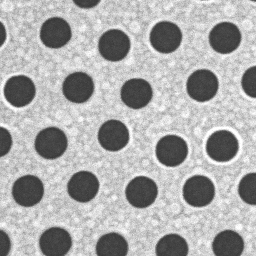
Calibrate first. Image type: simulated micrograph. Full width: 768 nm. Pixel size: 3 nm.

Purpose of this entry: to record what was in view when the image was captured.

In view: a regular array of holes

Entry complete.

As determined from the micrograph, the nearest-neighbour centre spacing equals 158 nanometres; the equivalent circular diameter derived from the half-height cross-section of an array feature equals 95.8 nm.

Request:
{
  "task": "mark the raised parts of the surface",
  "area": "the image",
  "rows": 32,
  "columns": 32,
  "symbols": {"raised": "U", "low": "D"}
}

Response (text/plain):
UUUUUUUUUDDDUUUUUUUUUUUUUUUUUUUU
UUUUUUUUUUUUUUUUUUUUUUUUUUUUUUUU
UUUUUUDDUUUUUUUUUUUUUUUUUUUUUUUU
DUUUUDDDDUUUUUUUUUUDDDUUUUUDDDUU
DUUUUDDDDUUUUDDDUUUDDDDUUUDDDDUU
UUUUUDDDUUUUDDDDUUUDDDUUUUDDDDUU
UUUUUUUUUUUUDDDDUUUUDUUUUUUDDUUU
UUUUUUUUUUUUUUDUUUUUUUUUUUUUUUUU
UUUUUUUUUUUUUUUUUUUUUUUUUUUUUUUD
UUDUUUUUDDDUUUUUUUUUUUUUDDDUUUDD
UDDDUUUUDDDDUUUDDDDUUUUDDDDUUUDD
UDDDUUUUDDDDUUUDDDDUUUUDDDDUUUUD
UDDDUUUUUDDUUUUDDDDUUUUUDDUUUUUU
UUUUUUUUUUUUUUUUDDUUUUUUUUUUUUUU
UUUUUUUUUUUUUUUUUUUUUUUUUUUUUUUU
UUUUUUUUUUUUUDDUUUUUUUUUUUUUUUUU
DUUUUDDDUUUUDDDDUUUUUUUUUUUDDUUU
DUUUDDDDUUUUDDDDUUUUDDDUUUDDDDUU
DUUUDDDDUUUUUDDUUUUDDDDUUUDDDDUU
UUUUUDDDUUUUUUUUUUUUDDDUUUDDDUUU
UUUUUUUUUUUUUUUUUUUUDDUUUUUUUUUU
UUUUUUUUUUDUUUUUUUUUUUUUUUUUUUUU
UUDDDUUUUDDDUUUUDDDUUUUDDDUUUUDD
UUDDDUUUDDDDUUUUDDDDUUUDDDDUUUDD
UUDDDUUUUDDDUUUUDDDDUUUDDDDUUUDD
UUDDDUUUUUUUUUUUDDDUUUUUDDUUUUUD
UUUUUUUUUUUUUUUUUUUUUUUUUUUUUUUU
UUUUUUUUUUUUUUUUUUUUUUUUUUUUUUUU
UUUUUUDDUUUUUUUUUUUUUUUUUUUUUUUU
DUUUUDDDDUUUUDDUUUUUUDDUUUUDDDUU
DUUUUDDDDUUUDDDDUUUUDDDUUUUDDDUU
DUUUUDDDDUUUDDDDUUUUDDDUUUUDDDUU